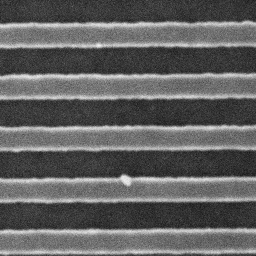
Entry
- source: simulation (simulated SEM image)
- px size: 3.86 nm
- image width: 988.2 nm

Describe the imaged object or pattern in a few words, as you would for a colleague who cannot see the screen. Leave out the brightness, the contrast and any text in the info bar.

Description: lines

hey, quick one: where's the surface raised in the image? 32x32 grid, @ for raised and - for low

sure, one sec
--------------------------------
--------------------------------
--------------------------------
@@@@@@@@@@@@@@@@@@@@@@@@@@@@@@@@
@@@@@@@@@@@@@@@@@@@@@@@@@@@@@@@@
@@@@@@@@@@@@@@@@@@@@@@@@@@@@@@@@
--------------------------------
--------------------------------
--------------------------------
-@@@@@@@@@@@@@@@@@@@@@@@@@@@@@@@
@@@@@@@@@@@@@@@@@@@@@@@@@@@@@@@@
@@@@@@@@@@@@@@@@@@@@@@@@@@@@@@@@
--------------------------------
--------------------------------
--------------------------------
--------------------------------
@@@@@@@@@@@@@@@@@@@@@@@@@@@@@@@@
@@@@@@@@@@@@@@@@@@@@@@@@@@@@@@@@
@@@@@@@@@@@@@@@@@@@@@@@@@@@@@@@@
--------------------------------
--------------------------------
--------------------------------
@@@@@@@@@@@@@@@@@@@@@@@@@@@@@@@@
@@@@@@@@@@@@@@@@@@@@@@@@@@@@@@@@
@@@@@@@@@@@@@@@@@@@@@@@@@@@@@@@@
--------------------------------
--------------------------------
--------------------------------
--------------------------------
@@@@@@@@@@@@@@@@@@@@@@@@@@@@@@@@
@@@@@@@@@@@@@@@@@@@@@@@@@@@@@@@@
@@@@@@@@@@@@@@@@@@@@@@@@@@@@@@@@